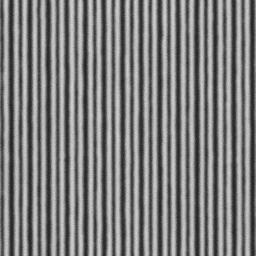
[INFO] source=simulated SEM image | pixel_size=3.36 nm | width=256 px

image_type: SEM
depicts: parallel lines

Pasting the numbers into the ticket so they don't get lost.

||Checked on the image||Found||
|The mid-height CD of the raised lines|15.5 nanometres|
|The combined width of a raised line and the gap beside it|0.0311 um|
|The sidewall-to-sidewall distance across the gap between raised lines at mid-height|15.5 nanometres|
